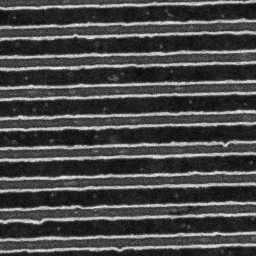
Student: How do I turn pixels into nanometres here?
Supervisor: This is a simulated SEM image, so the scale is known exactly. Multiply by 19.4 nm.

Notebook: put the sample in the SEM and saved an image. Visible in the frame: parallel lines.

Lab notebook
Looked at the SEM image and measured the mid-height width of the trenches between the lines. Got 0.223 microns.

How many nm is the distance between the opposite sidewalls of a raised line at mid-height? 370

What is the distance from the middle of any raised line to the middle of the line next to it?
588 nm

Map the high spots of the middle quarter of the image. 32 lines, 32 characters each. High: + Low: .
...............+++....++++++++++
++++++++++++++++++++++++++++++++
++++++++++++++++++++++++++++++++
++++++++++++++++++++++++++++++++
++++++++++++++++++++++++++++++++
+++.............................
................................
................................
...+...+.+++++++++++++++++++++++
++++++++++++++++++++++++++++++++
++++++++++++++++++++++++++++++++
++++++++++++++++++++++++++++++++
++++++++++++++++++++++.....++...
................................
................................
....................++...+++++++
++++++++++++++++++++++++++++++++
++++++++++++++++++++++++++++++++
++++++++++++++++++++++++++++++++
++++++++++++++++++++++++++++++++
+++++++++.......................
................................
................................
.........+..++++++++++++++++++++
++++++++++++++++++++++++++++++++
++++++++++++++++++++++++++++++++
++++++++++++++++++++++++++++++++
+++++++++++++++++++++++++++++++.
................................
................................
............................++++
++++++++++++++++++++++++++++++++